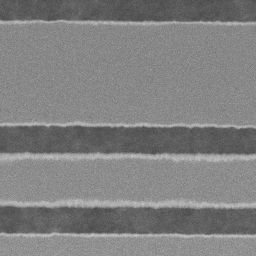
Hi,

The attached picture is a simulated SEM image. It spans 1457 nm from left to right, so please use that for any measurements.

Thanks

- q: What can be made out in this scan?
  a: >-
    lines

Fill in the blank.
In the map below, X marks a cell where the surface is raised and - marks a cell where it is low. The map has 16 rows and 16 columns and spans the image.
----------------
XXXXXXXXXXXXXXXX
XXXXXXXXXXXXXXXX
XXXXXXXXXXXXXXXX
XXXXXXXXXXXXXXXX
XXXXXXXXXXXXXXXX
XXXXXXXXXXXXXXXX
XXXXXXXXXXXXXXXX
----------------
----------------
XXXXXXXXXXXXXXXX
XXXXXXXXXXXXXXXX
XXXXXXXXXXXXXXXX
----------------
----------------
XXXXXXXXXXXXXXXX